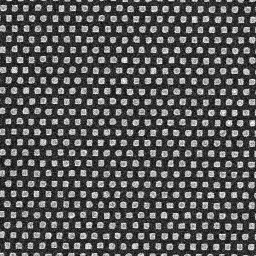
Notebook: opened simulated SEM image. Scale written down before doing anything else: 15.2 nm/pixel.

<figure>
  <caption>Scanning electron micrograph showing a regular array of raised bodies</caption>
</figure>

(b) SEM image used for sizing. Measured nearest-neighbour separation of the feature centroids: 172 nanometers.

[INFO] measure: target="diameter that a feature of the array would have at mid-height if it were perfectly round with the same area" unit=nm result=95.6